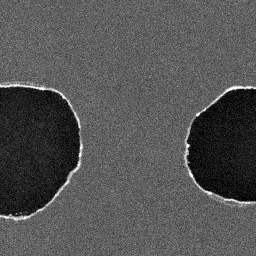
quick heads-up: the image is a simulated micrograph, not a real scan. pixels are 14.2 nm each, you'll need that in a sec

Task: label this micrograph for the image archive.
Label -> holes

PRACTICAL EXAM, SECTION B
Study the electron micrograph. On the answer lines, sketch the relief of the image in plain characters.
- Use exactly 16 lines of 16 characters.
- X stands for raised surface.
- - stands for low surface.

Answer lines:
XXXXXXXXXXXXXXXX
XXXXXXXXXXXXXXXX
XXXXXXXXXXXXXXXX
XXXXXXXXXXXXXXXX
XXXXXXXXXXXXXXXX
--XXXXXXXXXXXXXX
----XXXXXXXXX---
-----XXXXXXX----
-----XXXXXXX----
-----XXXXXXX----
-----XXXXXXX----
----XXXXXXXX----
---XXXXXXXXXXXX-
--XXXXXXXXXXXXXX
XXXXXXXXXXXXXXXX
XXXXXXXXXXXXXXXX